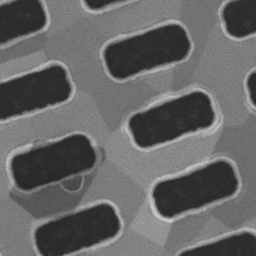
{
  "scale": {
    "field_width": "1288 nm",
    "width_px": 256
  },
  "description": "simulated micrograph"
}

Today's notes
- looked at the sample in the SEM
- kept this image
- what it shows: holes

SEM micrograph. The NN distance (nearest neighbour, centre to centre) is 0.368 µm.